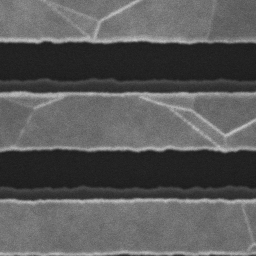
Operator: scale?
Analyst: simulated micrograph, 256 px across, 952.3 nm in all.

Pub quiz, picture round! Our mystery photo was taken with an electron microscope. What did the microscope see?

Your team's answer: lines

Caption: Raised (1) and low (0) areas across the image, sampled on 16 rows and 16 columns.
1111111111111111
1111111111111111
1111111111111111
0000000000000000
0000000000000000
0000000000000000
1111111111111111
1111111111111111
1111111111111111
0000000000000000
0000000000000000
0000000000000000
1011111111111111
1111111111111111
1111111111111111
1111111111111111